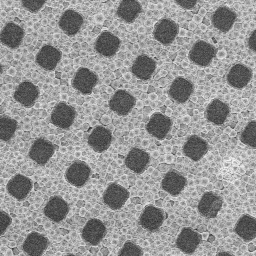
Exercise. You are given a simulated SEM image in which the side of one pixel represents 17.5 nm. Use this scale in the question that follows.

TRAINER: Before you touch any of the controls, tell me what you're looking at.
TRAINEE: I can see a regular array of raised bodies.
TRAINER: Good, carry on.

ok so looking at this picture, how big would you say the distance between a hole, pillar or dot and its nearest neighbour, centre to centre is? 727 nm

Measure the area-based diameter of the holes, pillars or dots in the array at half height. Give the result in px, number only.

24.5